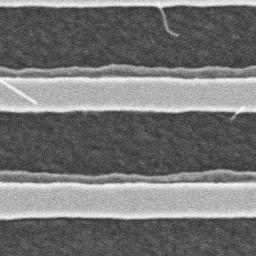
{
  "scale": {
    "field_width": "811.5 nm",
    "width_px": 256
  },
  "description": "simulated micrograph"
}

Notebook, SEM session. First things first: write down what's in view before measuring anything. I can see lines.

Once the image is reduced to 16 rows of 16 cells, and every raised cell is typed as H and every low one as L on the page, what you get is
LLLLLLLLLLLLLLLL
LLLLLLLLLLLLLLLL
LLLLLLLLLLLLLLLL
LLLLLLLLLLLLLLLL
HHHHHHHHHHHHHHHH
HHHHHHHHHHHHHHHH
HHHHHHHHHHHHHHHH
LLLLLLLLLLLLLLLL
LLLLLLLLLLLLLLLL
LLLLLLLLLLLLLLLL
LLLLLLLLLLLLLLLL
HHHHHHHHHHHHHHHH
HHHHHHHHHHHHHHHH
HHHHHHHHHHHHHHHH
LLLLLLLLLLLLLLLL
LLLLLLLLLLLLLLLL